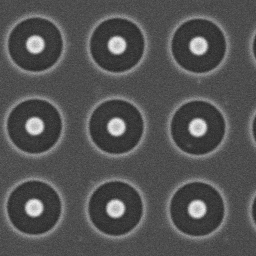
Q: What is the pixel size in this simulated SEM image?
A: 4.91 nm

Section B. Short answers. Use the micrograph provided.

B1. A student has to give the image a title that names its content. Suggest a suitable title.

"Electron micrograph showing an array of small figures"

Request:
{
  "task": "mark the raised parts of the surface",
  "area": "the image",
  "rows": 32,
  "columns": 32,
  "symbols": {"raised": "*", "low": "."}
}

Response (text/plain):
********************************
********************************
***...*******...********..******
**.....*****.....*****.....*****
*.......***.......****......****
*..**...***...**..***...**..****
*...*...***...*...***...*...****
**.....*****.....*****......****
***...*******...*******....*****
********************************
********************************
********************************
****.*********..****************
**.....*****.....*****.....*****
*......****.......****......****
*..**...***...*...***...**..****
*...*...***...*...***...*...***.
*......*****......****......****
**....******.....*****.....*****
********************************
********************************
********************************
********************************
**.....*****.....*****.....*****
*......****.......****......****
*..**...***...*...***...*...****
*..**...***...*...***...**..***.
*......****.......***.......****
**.....*****.....*****.....*****
**************.*********.*******
********************************
********************************